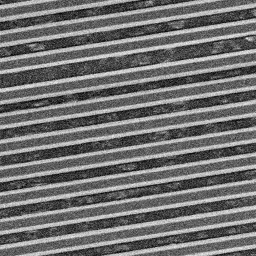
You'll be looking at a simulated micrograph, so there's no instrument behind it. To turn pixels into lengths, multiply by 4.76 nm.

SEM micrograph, parallel lines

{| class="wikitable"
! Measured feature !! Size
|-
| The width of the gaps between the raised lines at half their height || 62.9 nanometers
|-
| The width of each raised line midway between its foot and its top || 63.5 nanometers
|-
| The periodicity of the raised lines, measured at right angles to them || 126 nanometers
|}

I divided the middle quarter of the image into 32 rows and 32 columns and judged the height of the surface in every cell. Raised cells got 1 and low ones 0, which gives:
00000000000000000000000011111111
00000000000000000011111111111111
00000000000111111111111111111100
00001111111111111111111100000000
11111111111111111100000000000000
11111111111000000000000000000001
11111000000000000000000011111111
00000000000000000011111111111111
00000000000011111111111111111110
00000111111111111111111100000000
11111111111111111110000000000000
11111111111110000000000000000000
11111110000000000000000000001111
00000000000000000000011111111111
00000000000000011111111111111111
00000000111111111111111111111000
00111111111111111111111000000000
11111111111111110000000000000000
11111111110000000000000000000000
11100000000000000000000000111111
00000000000000000001111111111111
00000000000001111111111111111111
00000001111111111111111111100000
11111111111111111111100000000000
11111111111111000000000000000000
11111111000000000000000000000111
11000000000000000000000111111111
00000000000000001111111111111111
00000000001111111111111111111000
00011111111111111111111000000000
11111111111111110000000000000000
11111111110000000000000000000000